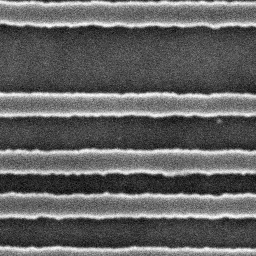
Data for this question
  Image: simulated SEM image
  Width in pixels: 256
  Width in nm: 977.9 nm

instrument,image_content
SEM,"lines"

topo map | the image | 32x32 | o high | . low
oooooooooooooooooooooooooooooooo
oooooooooooooooooooooooooooooooo
oooooooooooooooooooooooooooooooo
................................
................................
................................
................................
................................
................................
................................
................................
................................
oooooooooooooooooooooooooooooooo
oooooooooooooooooooooooooooooooo
................................
................................
................................
................................
................................
oooooooooooooooooooooooooooooooo
oooooooooooooooooooooooooooooooo
oooooooooooooo.oo.oooooooooooooo
................................
................................
oooooooooooooooooooooooooooooooo
oooooooooooooooooooooooooooooooo
oooooooooooooooooooooooooooooooo
................................
................................
................................
................................
oooooooooooooooooooooooooooooooo